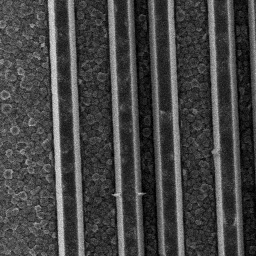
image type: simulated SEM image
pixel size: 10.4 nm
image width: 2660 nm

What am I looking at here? parallel lines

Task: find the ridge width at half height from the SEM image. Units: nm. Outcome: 206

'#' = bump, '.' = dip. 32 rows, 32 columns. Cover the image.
......###.....##...##.....###..#
......###.....##...##.....###..#
......###.....##...##.....###..#
.......##.....##...##.....###..#
.......##.....##...###....###...
.......##.....###..###.....##...
.......##.....###..###.....##...
.......##.....###..###.....##...
.......##.....###..###.....##...
.......##.....###..###.....##...
.......##.....###..###.....##...
.......##.....###..###.....##...
.......##.....###..###.....##...
.......##.....###..###.....##...
.......##.....###..###.....##...
.......##......##..###.....##...
.......###.....##...##.....##...
.......###.....##...##.....###..
.......###.....##...##.....###..
.......###.....##...##.....###..
.......###.....##...##.....###..
.......###.....##...##.....###..
.......###.....##...##.....###..
.......###.....##...##.....###..
.......###.....##...##.....###..
........##.....##...##.....###..
........##.....##...##......##..
........##.....##...###....###..
........##.....##...###.....##..
........##.....###..###.....##..
........##.....###..###.....##..
........##.....###..###.....##..